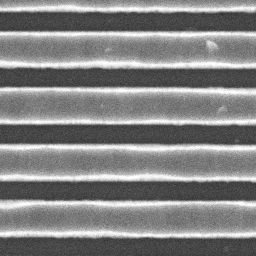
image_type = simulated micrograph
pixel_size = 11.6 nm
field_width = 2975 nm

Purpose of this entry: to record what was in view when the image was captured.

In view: lines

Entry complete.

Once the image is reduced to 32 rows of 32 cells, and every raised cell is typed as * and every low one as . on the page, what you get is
********************************
................................
................................
................................
********************************
********************************
********************************
********************************
................................
................................
................................
********************************
********************************
********************************
********************************
................................
................................
................................
********************************
********************************
********************************
********************************
................................
................................
................................
********************************
********************************
********************************
********************************
................***************.
................................
................................